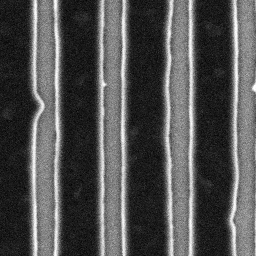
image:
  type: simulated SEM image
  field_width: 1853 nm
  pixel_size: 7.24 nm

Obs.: one or a few lines or trenches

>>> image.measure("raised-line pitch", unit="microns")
0.484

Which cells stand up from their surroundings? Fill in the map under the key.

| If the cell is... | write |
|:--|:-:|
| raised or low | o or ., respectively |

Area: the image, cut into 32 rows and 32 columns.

oooo...oooooo..ooooooo..ooooo...
oooo...oooooo..oooooo...ooooo...
ooooo..oooooo..oooooo...ooooo...
oooo...oooooo..oooooo...ooooo...
oooo...oooooo..oooooo...ooooo...
oooo...oooooo..oooooo...oooooo..
oooo...oooooo..oooooo...oooooo..
oooo...oooooo..oooooo...oooooo..
oooo...oooooo..oooooo...oooooo..
oooo...oooooo..oooooo...oooooo..
oooo...oooooo..oooooo...oooooo..
ooooo..oooooo..oooooo...oooooo..
ooooo..oooooo..oooooo...oooooo..
ooooo..oooooo..oooooo...ooooo...
ooooo..oooooo..oooooo...ooooo...
ooooo..oooooo..oooooo...ooooo...
oooo...oooooo..oooooo...ooooo...
oooo...oooooo..oooooo...ooooo...
oooo...oooooo..oooooo...ooooo...
oooo...oooooo..oooooo...oooooo..
oooo...oooooo..oooooo...oooooo..
oooo...oooooo..oooooo...oooooo..
oooo...oooooo..oooooo...oooooo..
oooo...oooooo..oooooo...oooooo..
oooo...oooooo..oooooo...ooooo...
oooo...oooooo..oooooo...ooooo...
oooo...oooooo..oooooo...ooooo...
oooo...oooooo..oooooo...ooooo...
oooo...oooooo..oooooo...ooooo...
oooo...oooooo..ooooooo..ooooo...
oooo...oooooo..ooooooo..ooooo...
oooo...oooooo..ooooooo..ooooo...